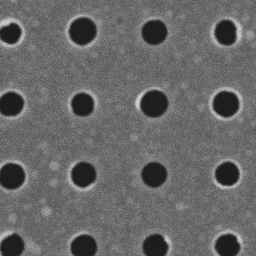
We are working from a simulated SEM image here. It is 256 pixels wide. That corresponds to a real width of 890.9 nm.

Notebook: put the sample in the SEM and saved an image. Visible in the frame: a regular array of holes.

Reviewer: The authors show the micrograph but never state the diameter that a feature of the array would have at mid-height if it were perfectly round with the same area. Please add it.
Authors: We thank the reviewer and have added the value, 0.0901 um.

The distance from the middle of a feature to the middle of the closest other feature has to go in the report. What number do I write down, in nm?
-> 246